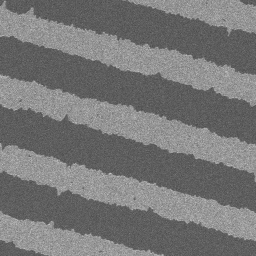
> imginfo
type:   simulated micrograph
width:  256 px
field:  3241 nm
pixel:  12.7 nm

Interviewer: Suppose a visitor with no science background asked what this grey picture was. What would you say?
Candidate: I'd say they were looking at one or a few lines or trenches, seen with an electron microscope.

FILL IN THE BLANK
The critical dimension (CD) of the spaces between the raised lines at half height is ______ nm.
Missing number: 488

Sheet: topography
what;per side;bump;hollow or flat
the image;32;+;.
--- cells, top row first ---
.................++++++++++++++.
+..+.................+++++++++++
++++++...................+++++++
++++++++++..................++++
..++++++++++++..................
....+++++++++++++...............
........++++++++++++++..........
............++++++++++++++......
...............++++++++++++++...
+...................++++++++++++
+++++..................+++++++++
++++++++...................+++++
++++++++++++...................+
.++++++++++++++++...............
......++++++++++++++............
...........++++++++++++.........
.............+++++++++++++......
.................+++++++++++++..
++..................++++++++++++
+++++...................++++++++
++++++++....................++++
.++++++++++++..................+
....+++++++++++++...............
.......+++++++++++++............
..........++++++++++++++........
...............++++++++++++.....
...................+++++++++++++
++....................++++++++++
+++++++....................+++++
+++++++++++..................+++
..+++++++++++++.................
.....++++++++++++++.............